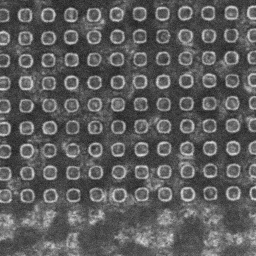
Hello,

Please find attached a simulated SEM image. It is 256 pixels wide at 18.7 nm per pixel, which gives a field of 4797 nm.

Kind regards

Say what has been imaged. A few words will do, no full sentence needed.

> a regular array of raised bodies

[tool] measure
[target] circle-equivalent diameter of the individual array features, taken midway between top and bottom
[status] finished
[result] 249 nm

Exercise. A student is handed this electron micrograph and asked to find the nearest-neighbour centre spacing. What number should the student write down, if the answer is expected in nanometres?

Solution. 418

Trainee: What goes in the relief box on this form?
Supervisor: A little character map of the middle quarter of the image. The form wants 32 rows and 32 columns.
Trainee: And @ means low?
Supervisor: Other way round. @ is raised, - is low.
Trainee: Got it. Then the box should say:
--------------------------------
--------------------------------
--------------------------------
-@@----@@---@@@---@@----@@---@@@
-@@---@@@---@@@---@@@--@@@---@@@
-@@---@@@---@@@---@@---@@@----@@
--------------------------------
--------------------------------
------------------------------@@
-@@---@@@---@@@---@@@---@@---@@@
-@@@--@@@---@@@---@@@---@@---@@@
-@@----@@---@@----@@------------
--------------------------------
--------------------------------
-@@----@@----@----@@@---@@----@@
-@@@--@@@---@@@---@@@---@@@--@@@
-@@@--@@@---@@@---@@@---@@@--@@@
--------------------------------
--------------------------------
--------------------------------
-@@----@@---@@@---@@@---@@@--@@@
-@@@---@@---@@@---@@@---@@@--@@@
-@@@---@@---@@@---@@----@@----@-
--------------------------------
--------------------------------
------------------------@@----@@
-@@@--@@@@--@@@---@@@---@@@--@@@
-@@@--@@@@--@@@---@@@---@@@--@@@
-@@----@@----@@-----------------
--------------------------------
--------------------------------
-@@----@@----@@---@@@---@@----@@